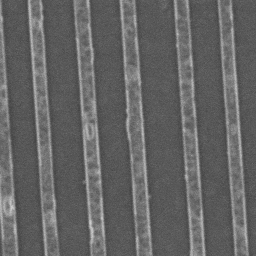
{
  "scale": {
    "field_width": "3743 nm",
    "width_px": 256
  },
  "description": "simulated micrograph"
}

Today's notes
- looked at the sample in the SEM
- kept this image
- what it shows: parallel lines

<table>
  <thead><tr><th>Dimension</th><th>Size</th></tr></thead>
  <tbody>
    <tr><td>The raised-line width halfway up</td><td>0.188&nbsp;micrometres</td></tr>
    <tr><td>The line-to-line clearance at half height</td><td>469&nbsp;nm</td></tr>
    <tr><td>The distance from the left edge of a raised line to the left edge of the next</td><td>689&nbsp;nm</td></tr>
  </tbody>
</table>